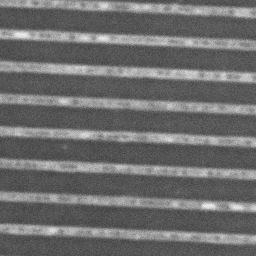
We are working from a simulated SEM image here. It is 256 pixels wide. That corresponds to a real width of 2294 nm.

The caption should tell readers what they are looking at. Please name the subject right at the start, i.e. parallel lines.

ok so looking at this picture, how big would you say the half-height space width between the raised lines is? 227 nm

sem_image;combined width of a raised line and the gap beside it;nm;290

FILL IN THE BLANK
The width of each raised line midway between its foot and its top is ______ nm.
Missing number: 67.1